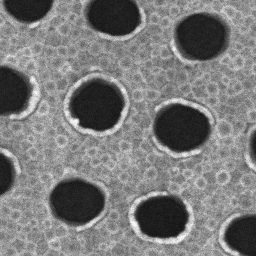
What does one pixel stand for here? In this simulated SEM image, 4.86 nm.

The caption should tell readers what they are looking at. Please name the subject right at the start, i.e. holes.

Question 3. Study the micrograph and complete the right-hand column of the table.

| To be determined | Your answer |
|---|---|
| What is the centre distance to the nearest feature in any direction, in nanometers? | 425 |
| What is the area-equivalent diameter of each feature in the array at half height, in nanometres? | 250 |